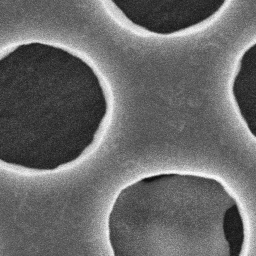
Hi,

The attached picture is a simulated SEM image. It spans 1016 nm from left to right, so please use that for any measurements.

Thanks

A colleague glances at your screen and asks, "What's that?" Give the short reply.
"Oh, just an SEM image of holes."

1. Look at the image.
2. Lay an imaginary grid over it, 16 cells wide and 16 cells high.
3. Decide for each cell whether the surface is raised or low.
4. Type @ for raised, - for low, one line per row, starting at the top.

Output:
@@@@@@@-------@@
@@@@@@@@-----@@@
@@@@@@@@@@@@@@@@
-----@@@@@@@@@@-
------@@@@@@@@@-
-------@@@@@@@@-
-------@@@@@@@@-
-------@@@@@@@@-
------@@@@@@@@@@
------@@@@@@@@@@
@---@@@@@@@@@@@@
@@@@@@@@------@@
@@@@@@@--------@
@@@@@@@--------@
@@@@@@@---@----@
@@@@@@@---@@---@